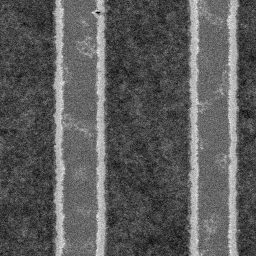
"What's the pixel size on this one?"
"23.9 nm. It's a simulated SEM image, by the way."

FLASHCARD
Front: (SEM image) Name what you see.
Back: one or a few lines or trenches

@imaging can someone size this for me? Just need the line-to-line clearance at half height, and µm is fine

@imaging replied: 2.2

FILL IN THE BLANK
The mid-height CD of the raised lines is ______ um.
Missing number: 0.972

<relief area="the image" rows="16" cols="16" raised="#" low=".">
....##......###.
....##......###.
....##......###.
....##......###.
....##......###.
....##......###.
....##......###.
....##......###.
....##......###.
....##......###.
....##......###.
....##......###.
....##......###.
....##......###.
....##......###.
....##......###.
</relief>